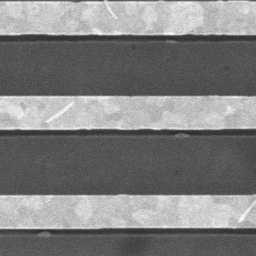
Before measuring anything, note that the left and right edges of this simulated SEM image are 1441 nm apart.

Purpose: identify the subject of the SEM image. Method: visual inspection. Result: lines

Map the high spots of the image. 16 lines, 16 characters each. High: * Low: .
****************
****************
................
................
................
................
****************
****************
................
................
................
................
****************
****************
................
................